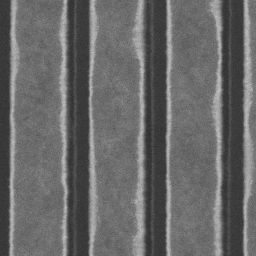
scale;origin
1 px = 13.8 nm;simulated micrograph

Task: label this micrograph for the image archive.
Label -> lines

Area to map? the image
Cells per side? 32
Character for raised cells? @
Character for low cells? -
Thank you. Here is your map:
-@@@@@@@---@@@@@@@---@@@@@@@---@
-@@@@@@@---@@@@@@@---@@@@@@@---@
-@@@@@@@---@@@@@@@---@@@@@@@---@
-@@@@@@@---@@@@@@@---@@@@@@@---@
-@@@@@@@---@@@@@@@---@@@@@@@---@
-@@@@@@@---@@@@@@@---@@@@@@@---@
-@@@@@@@---@@@@@@@---@@@@@@@---@
-@@@@@@@---@@@@@@@---@@@@@@@---@
-@@@@@@@---@@@@@@@---@@@@@@@---@
-@@@@@@@---@@@@@@@---@@@@@@@---@
-@@@@@@@---@@@@@@@---@@@@@@@---@
-@@@@@@@---@@@@@@@---@@@@@@@---@
-@@@@@@@---@@@@@@@---@@@@@@@---@
-@@@@@@@---@@@@@@@---@@@@@@@---@
-@@@@@@@---@@@@@@@---@@@@@@@---@
-@@@@@@@---@@@@@@@---@@@@@@@---@
-@@@@@@@---@@@@@@@---@@@@@@@---@
-@@@@@@@---@@@@@@@---@@@@@@@---@
-@@@@@@@---@@@@@@@---@@@@@@@---@
-@@@@@@@---@@@@@@@---@@@@@@@---@
-@@@@@@@---@@@@@@@---@@@@@@@---@
-@@@@@@@---@@@@@@@---@@@@@@@---@
-@@@@@@@---@@@@@@@---@@@@@@@---@
-@@@@@@@---@@@@@@@---@@@@@@@---@
-@@@@@@@---@@@@@@@---@@@@@@@---@
-@@@@@@@---@@@@@@@---@@@@@@@--@@
-@@@@@@@---@@@@@@@---@@@@@@@--@@
-@@@@@@@---@@@@@@@---@@@@@@@---@
-@@@@@@@---@@@@@@@---@@@@@@@---@
-@@@@@@@---@@@@@@@---@@@@@@@---@
-@@@@@@@---@@@@@@@---@@@@@@@--@@
-@@@@@@@---@@@@@@@---@@@@@@@---@